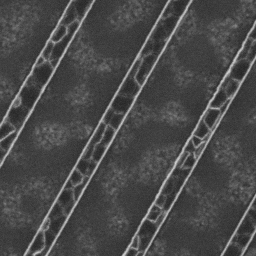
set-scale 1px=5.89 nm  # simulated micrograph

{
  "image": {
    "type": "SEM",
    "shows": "one or a few lines or trenches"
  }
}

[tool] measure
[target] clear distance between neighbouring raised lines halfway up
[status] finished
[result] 0.39 um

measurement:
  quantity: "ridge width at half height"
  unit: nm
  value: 116